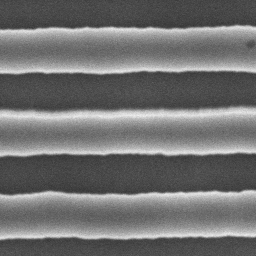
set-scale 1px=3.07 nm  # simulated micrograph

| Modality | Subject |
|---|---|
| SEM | lines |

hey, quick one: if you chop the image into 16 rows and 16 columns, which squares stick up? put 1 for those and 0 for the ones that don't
0000000000000000
0000000000000000
1111111111111111
1111111111111111
1111111100000000
0000000000000000
0000000000000000
1111111111111111
1111111111111111
1111111111111111
0000000000000000
0000000000000000
1111111111111111
1111111111111111
1111111111111111
0000000000000000